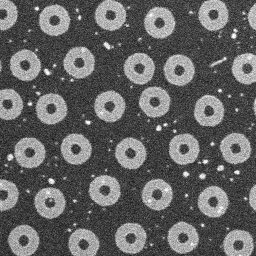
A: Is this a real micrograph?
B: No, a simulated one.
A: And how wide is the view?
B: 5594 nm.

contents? a regular array of ring-shaped raised bodies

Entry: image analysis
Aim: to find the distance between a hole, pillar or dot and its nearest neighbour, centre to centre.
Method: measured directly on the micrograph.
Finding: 1010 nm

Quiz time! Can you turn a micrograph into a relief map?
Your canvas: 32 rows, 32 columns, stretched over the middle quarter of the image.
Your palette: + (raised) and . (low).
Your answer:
+++..++........+++..+++..+++..++
.++++++........++...++...++...++
..++++..........++..++...+++..++
................++++++....++++++
.................++++......++++.
................................
....................+++++.......
.........++++.......++++++......
........++++++.....+++..++......
........+++.+++....++...++......
........++...++....+++..++......
+.......++...++.....++++++......
........++++++.......++++.......
.........+++++..................
................................
................................
................................
................................
+++++.......................++++
++++++........+++++........+++++
++..+++......+++++++.......++..+
++...++......++...++.......++..+
++..++.......++...++.......++..+
++++++.......+++..++.......+++++
.+++..........++++++........++++
...............++++.............
................................
..............................+.
........++++....................
.......++++++........++++.......
.......++..+++......++++++......
.......++...++......+++.+++.....